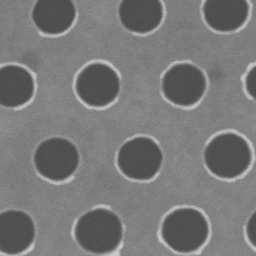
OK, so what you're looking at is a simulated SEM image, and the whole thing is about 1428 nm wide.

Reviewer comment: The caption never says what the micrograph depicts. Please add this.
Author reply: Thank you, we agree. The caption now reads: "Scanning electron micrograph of holes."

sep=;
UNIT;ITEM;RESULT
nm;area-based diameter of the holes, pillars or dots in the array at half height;237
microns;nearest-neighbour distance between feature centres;0.465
